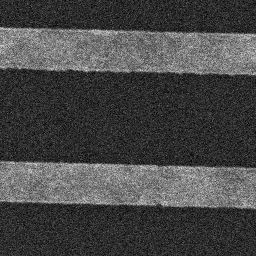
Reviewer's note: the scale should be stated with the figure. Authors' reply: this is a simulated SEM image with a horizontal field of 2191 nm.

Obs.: one or a few lines or trenches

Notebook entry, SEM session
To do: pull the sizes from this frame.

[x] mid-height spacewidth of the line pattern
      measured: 94.8 pixels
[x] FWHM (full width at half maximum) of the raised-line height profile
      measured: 330 nm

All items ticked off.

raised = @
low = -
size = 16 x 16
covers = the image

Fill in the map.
----------------
----------------
@@@@@@@@@@@@@@@@
@@@@@@@@@@@@@@@@
-----------@@@@@
----------------
----------------
----------------
----------------
----------------
@@@@@@@@@@@@@---
@@@@@@@@@@@@@@@@
@@@@@@@@@@@@@@@@
----------------
----------------
----------------